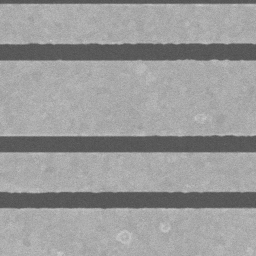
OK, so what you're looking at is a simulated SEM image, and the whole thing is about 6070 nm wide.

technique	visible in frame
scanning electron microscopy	lines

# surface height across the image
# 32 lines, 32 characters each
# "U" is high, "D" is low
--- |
DDDDDDDDDDDDDDDDDDDDDDDDDDDDDDDD
UUUUUUUUUUUUUUUUUUUUUUUUUUUUUUUU
UUUUUUUUUUUUUUUUUUUUUUUUUUUUUUUU
UUUUUUUUUUUUUUUUUUUUUUUUUUUUUUUU
UUUUUUUUUUUUUUUUUUUUUUUUUUUUUUUU
DDDDDDDDDDDDDDDDDDDDDDDDDDDDDDDD
DDDDDDDDDDDDDDDDDDDDDDDDDDDDDDDD
DDDDDDDDDDDDDDDDDDDDDDDDDDDDDDDD
UUUUUUUUUUUUUUUUUUUUUUUUUUUUUUUU
UUUUUUUUUUUUUUUUUUUUUUUUUUUUUUUU
UUUUUUUUUUUUUUUUUUUUUUUUUUUUUUUU
UUUUUUUUUUUUUUUUUUUUUUUUUUUUUUUU
UUUUUUUUUUUUUUUUUUUUUUUUUUUUUUUU
UUUUUUUUUUUUUUUUUUUUUUUUUUUUUUUU
UUUUUUUUUUUUUUUUUUUUUUUUUUUUUUUU
UUUUUUUUUUUUUUUUUUUUUUUUUUUUUUUU
UUUUUUUUUUUUUUUUUUUUUUUUUUUUUUUU
DDDDDDDDDDDDDDDDDDDDDDDDDDDDDDDD
DDDDDDDDDDDDDDDDDDDDDDDDDDDDDDDD
UUUUUUUUUUUUUUUUUUUUUUUUUUUUUUUU
UUUUUUUUUUUUUUUUUUUUUUUUUUUUUUUU
UUUUUUUUUUUUUUUUUUUUUUUUUUUUUUUU
UUUUUUUUUUUUUUUUUUUUUUUUUUUUUUUU
UUUUUUUUUUUUUUUUUUUUUUUUUUUUUUUU
DDDDDDDDDDDDDDDDDDDDDDDDDDDDDDDD
DDDDDDDDDDDDDDDDDDDDDDDDDDDDDDDD
UUUUUUUUUUUUUUUUUUUUUUUUUUUUUUUU
UUUUUUUUUUUUUUUUUUUUUUUUUUUUUUUU
UUUUUUUUUUUUUUUUUUUUUUUUUUUUUUUU
UUUUUUUUUUUUUUUUUUUUUUUUUUUUUUUU
UUUUUUUUUUUUUUUUUUUUUUUUUUUUUUUU
UUUUUUUUUUUUUUUUUUUUUUUUUUUUUUUU